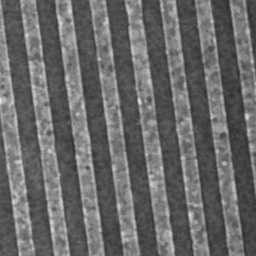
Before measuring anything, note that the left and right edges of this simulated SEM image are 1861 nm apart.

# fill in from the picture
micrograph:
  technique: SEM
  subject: parallel lines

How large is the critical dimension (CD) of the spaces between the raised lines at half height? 153 nm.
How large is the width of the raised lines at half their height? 13.8 px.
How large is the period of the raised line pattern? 252 nm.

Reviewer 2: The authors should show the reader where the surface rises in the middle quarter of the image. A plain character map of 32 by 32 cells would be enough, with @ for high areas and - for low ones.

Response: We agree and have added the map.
@@@@-----@@@------@@@-----@@@@--
@@@@-----@@@------@@@------@@@--
-@@@-----@@@@-----@@@------@@@--
-@@@-----@@@@-----@@@------@@@--
-@@@-----@@@@-----@@@---@@-@@@--
-@@@------@@@-----@@@@---@-@@@--
-@@@------@@@-----@@@@-----@@@@-
-@@@@-----@@@------@@@-----@@@@-
-@@@@-----@@@------@@@------@@@-
-@@@@-----@@@@-----@@@------@@@-
--@@@-----@@@@-----@@@------@@@-
--@@@-----@@@@-----@@@------@@@-
--@@@-----@@@@-----@@@@-----@@@-
--@@@------@@@-----@@@@-----@@@-
--@@@----@-@@@------@@@-----@@@@
--@@@@---@-@@@------@@@-@---@@@@
--@@@@-----@@@@-----@@@-@@---@@@
---@@@-----@@@@-----@@@------@@@
---@@@-----@@@@-----@@@@-----@@@
---@@@-----@@@@-----@@@@-----@@@
@@-@@@------@@@-----@@@@-----@@@
@@-@@@------@@@-----@@@@-----@@@
---@@@@-----@@@------@@@-----@@@
---@@@@-----@@@------@@@------@@
---@@@@-----@@@@-----@@@------@@
----@@@-----@@@@-----@@@------@@
----@@@-----@@@@-----@@@------@@
----@@@-----@@@@-----@@@@-----@@
----@@@------@@@-----@@@@-----@@
----@@@------@@@------@@@-----@@
----@@@@-----@@@------@@@-----@@
----@@@@-----@@@@-----@@@------@